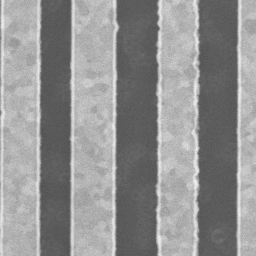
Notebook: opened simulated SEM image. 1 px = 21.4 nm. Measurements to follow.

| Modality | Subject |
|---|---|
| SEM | one or a few lines or trenches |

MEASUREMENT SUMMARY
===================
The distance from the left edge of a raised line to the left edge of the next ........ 1690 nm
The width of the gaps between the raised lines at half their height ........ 928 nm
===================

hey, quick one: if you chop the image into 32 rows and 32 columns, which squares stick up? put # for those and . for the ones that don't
#####....#####......####......##
#####....#####......#####.....##
#####....#####......#####.....##
#####....#####......#####.....##
#####....#####......####......##
#####....#####......#####.....##
#####....#####......#####.....##
#####....#####......####......##
#####....#####......#####.....##
#####....#####......#####.....##
#####....#####......####......##
#####....#####......####......##
#####....#####......####......##
#####....#####......#####.....##
#####....#####......#####.....##
#####....#####......####......##
#####....#####......####......##
#####....#####......#####.....##
#####....#####......#####.....##
#####....#####......#####.....##
#####....#####......####......##
#####....#####......#####.....##
#####....#####......####......##
#####....#####......####......##
#####....#####......####......##
#####....#####......####......##
#####....#####......####......##
#####....#####......####......##
#####....#####......####......##
#####....#####......####......##
#####....#####......####......##
#####....#####......####......##